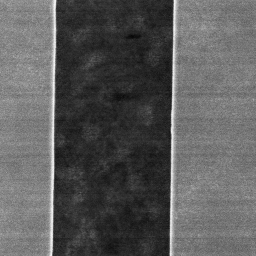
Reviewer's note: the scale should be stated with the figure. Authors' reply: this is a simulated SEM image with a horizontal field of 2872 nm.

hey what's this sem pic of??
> one or a few lines or trenches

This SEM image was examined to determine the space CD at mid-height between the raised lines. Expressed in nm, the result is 1320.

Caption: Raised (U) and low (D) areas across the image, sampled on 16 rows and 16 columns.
UUUDDDDDDDDUUUUU
UUUDDDDDDDDUUUUU
UUUDDDDDDDDUUUUU
UUUDDDDDDDDUUUUU
UUUDDDDDDDDUUUUU
UUUDDDDDDDDUUUUU
UUUDDDDDDDDUUUUU
UUUDDDDDDDDUUUUU
UUUDDDDDDDDUUUUU
UUUDDDDDDDDUUUUU
UUUDDDDDDDDUUUUU
UUUDDDDDDDDUUUUU
UUUDDDDDDDDUUUUU
UUUDDDDDDDDUUUUU
UUUDDDDDDDDUUUUU
UUUDDDDDDDDUUUUU